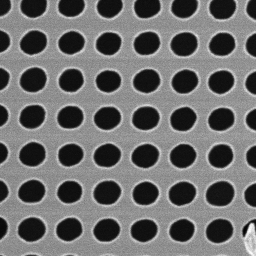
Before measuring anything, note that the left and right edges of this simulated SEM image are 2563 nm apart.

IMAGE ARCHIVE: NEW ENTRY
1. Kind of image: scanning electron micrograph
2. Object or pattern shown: a regular array of holes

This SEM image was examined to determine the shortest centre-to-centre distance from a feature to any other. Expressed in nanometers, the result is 370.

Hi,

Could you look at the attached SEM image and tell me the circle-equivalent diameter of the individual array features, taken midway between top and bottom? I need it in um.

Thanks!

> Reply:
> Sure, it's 0.252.